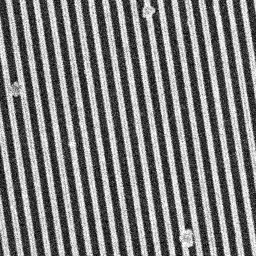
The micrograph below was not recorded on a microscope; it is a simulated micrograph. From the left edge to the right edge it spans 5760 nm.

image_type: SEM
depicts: parallel lines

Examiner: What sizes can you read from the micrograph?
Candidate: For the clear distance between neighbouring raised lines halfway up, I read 233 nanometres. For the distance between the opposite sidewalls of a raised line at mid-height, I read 86.1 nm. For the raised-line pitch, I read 307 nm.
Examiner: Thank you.